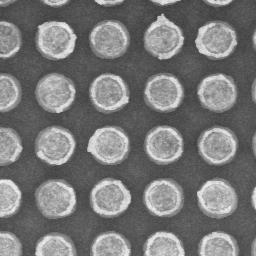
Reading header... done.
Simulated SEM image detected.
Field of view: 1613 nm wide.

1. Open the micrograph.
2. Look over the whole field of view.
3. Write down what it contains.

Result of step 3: a regular array of raised bodies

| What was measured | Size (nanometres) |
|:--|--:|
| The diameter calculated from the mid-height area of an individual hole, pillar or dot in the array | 235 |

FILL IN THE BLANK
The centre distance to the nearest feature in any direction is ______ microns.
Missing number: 0.332